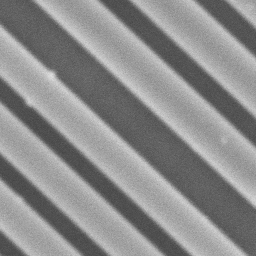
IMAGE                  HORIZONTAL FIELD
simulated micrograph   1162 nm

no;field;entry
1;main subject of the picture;groups of lines, slits or small figures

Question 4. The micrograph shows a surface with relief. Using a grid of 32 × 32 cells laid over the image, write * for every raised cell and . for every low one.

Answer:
.....********....********....***
......********....********....**
.......********....********....*
........********....********....
*........********....********...
**........********....********..
***........********....********.
*****.......********....********
******.......********....*******
*******........*******.....*****
.*******........*******.....****
..*******........*******.....***
...*******........*******.....**
*...*******........********....*
**...*******........********....
***...*******........********...
****....******........********..
*****....******........********.
******....******........********
.******....******........*******
..******....******........******
...******....******........*****
....******....*******.......****
*....******....*******........**
**....******....*******........*
***....*******...*******........
****....*******...*******.......
*****....*******...*******......
******....*******...*******.....
.*******...*******...*******....
..*******...*******....******...
...*******...*******....******..